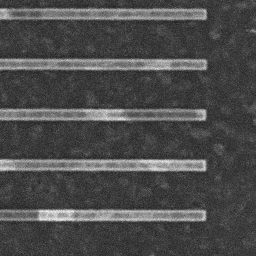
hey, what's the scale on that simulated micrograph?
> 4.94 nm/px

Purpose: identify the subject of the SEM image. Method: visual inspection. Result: parallel lines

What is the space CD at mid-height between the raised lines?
206 nm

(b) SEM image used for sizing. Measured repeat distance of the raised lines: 248 nm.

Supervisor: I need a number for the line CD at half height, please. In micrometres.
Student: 0.0444